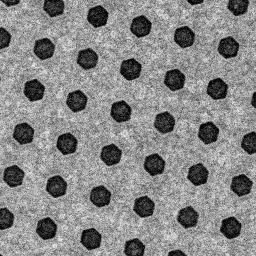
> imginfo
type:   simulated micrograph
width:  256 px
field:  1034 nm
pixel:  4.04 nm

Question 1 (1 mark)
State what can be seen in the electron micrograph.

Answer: a regular array of holes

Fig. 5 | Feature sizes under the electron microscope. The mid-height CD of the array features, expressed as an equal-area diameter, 0.0877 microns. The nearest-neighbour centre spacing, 175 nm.